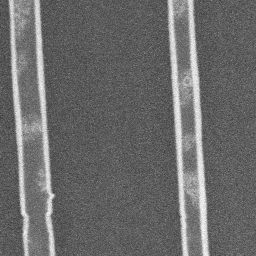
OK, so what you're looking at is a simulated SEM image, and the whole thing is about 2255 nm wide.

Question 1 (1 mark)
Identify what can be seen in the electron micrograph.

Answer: one or a few lines or trenches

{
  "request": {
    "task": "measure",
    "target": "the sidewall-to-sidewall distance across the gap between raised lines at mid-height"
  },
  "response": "1160 nanometers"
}